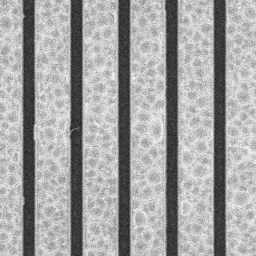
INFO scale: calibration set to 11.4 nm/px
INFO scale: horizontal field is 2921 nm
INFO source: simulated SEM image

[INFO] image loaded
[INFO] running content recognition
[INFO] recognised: parallel lines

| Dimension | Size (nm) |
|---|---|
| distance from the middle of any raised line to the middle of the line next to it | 546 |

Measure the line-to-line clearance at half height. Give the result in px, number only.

12.5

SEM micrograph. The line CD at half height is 0.4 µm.